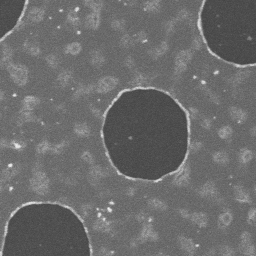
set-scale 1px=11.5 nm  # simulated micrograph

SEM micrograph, holes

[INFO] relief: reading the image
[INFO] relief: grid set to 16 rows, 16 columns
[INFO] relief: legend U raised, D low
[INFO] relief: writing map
DUUUUUUUUUUUUDDD
DUUUUUUUUUUUUDDD
UUUUUUUUUUUUUDDD
UUUUUUUUUUUUUUDD
UUUUUUUUUUUUUUUU
UUUUUUUUUUUUUUUU
UUUUUUUDDDDUUUUU
UUUUUUUDDDDDUUUU
UUUUUUDDDDDDUUUU
UUUUUUUDDDDDUUUU
UUUUUUUDDDDUUUUU
UUUUUUUUUUUUUUUU
UUUUUUUUUUUUUUUU
UDDDDUUUUUUUUUUU
DDDDDUUUUUUUUUUU
DDDDDDUUUUUUUUUU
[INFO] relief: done